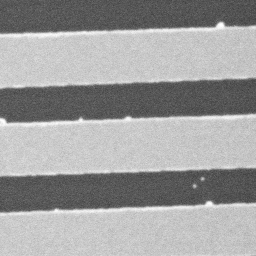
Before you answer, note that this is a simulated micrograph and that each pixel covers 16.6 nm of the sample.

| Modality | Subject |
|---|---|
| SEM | lines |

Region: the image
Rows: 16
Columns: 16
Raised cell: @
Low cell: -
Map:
----------------
----------------
@@@@@@@@@@@@@@@@
@@@@@@@@@@@@@@@@
@@@@@@@@@@@@@@@@
----------------
----------------
-------@@@@@@@@@
@@@@@@@@@@@@@@@@
@@@@@@@@@@@@@@@@
@@@@@@@@@@@@@@@-
----------------
----------------
@@@@@@@@@@@@@@@@
@@@@@@@@@@@@@@@@
@@@@@@@@@@@@@@@@